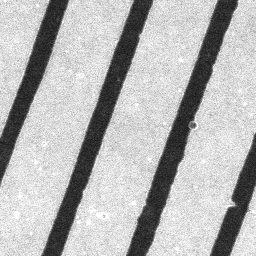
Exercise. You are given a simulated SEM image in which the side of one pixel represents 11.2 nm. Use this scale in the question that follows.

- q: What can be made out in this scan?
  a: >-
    one or a few lines or trenches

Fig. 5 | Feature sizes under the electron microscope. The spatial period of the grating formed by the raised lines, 0.882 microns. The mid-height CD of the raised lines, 236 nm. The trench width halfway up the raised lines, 649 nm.